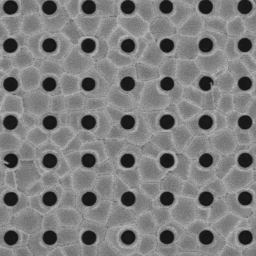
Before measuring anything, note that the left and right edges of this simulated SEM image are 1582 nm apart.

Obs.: a regular array of holes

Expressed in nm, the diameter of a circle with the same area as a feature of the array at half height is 88.7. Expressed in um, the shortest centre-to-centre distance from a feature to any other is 0.237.